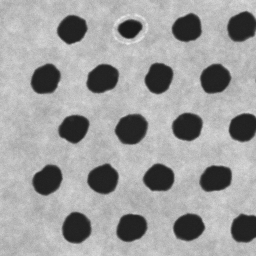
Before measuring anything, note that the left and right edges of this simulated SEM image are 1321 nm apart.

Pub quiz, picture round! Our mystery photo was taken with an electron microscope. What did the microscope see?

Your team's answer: a regular array of holes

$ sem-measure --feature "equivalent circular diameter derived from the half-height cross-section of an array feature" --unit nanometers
144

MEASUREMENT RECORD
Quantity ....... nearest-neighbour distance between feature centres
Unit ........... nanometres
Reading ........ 289